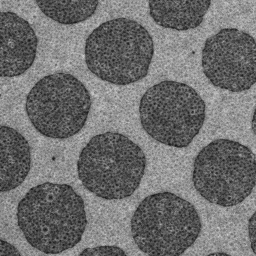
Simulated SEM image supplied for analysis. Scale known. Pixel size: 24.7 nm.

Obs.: holes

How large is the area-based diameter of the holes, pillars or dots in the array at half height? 1560 nm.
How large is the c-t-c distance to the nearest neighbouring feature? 1980 nanometers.